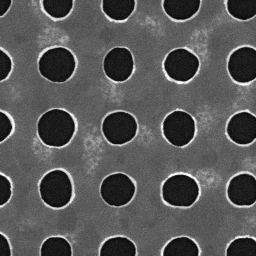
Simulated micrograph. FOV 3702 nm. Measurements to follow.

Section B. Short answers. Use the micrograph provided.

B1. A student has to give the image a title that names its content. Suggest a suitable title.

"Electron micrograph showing a regular array of holes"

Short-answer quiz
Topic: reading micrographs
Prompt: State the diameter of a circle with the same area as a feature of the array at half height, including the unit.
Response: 500 nanometers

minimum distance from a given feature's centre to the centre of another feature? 887 nm